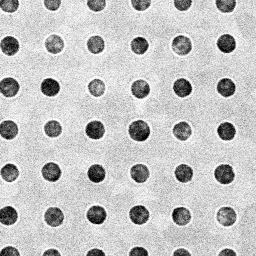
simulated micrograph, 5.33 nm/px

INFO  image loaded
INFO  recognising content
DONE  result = a regular array of holes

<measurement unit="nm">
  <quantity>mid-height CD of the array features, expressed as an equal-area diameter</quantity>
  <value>110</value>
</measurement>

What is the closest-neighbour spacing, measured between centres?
224 nm